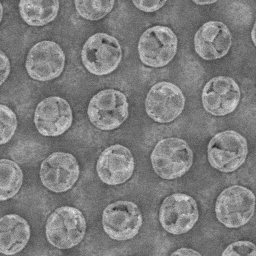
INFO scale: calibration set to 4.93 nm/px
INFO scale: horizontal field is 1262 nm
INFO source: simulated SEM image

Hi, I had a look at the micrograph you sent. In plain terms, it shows a regular array of raised bodies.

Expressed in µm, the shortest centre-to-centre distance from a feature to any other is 0.275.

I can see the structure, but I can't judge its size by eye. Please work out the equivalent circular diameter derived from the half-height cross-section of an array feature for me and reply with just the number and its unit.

189 nm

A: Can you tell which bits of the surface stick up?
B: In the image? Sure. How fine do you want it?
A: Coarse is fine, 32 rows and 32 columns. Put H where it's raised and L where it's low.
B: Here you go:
LLLHHHHLLLHHHHLLLHHHLLLLLLLLLLLL
LLLHHHHLLLHHHHLLLLLLLLLLLLLLLLLL
LLLHHHLLLLLLLLLLLLLLLLLLLLLLLLLL
LLLLLLLLLLLLLLLLLLLHHLLLLHHHLLLL
LLLLLLLLLLLLHLLLLLHHHHLLLHHHHLLL
LLLLLHHLLLLHHHHLLHHHHHLLHHHHHLLL
LLLLHHHHLLHHHHHLLLHHHHLLLHHHLLLL
HLLHHHHHLLHHHHHLLLHHHLLLLLLLLLLL
HLLHHHHHLLLHHHLLLLLLLLLLLLLLLLLL
HLLLHHHLLLLLLLLLLLLLLLLLLLLLLLLL
LLLLLLLLLLLLLLLLLLLLHLLLLLHHHLLL
LLLLLLLLLLLLLHHLLLLHHHLLLHHHHHLL
LLLLLLHHLLLHHHHHLLHHHHHLLHHHHHLL
HLLLLHHHHLLHHHHHLLHHHHHLLLHHHLLL
HHLLHHHHHLLHHHHHLLLHHHLLLLLLLLLL
HHLLHHHHHLLLHHHLLLLLLLLLLLLLLLLL
HHLLLHHHLLLLLLLLLLLLLLLLLLLLHLLL
HLLLLLLLLLLLLLLLLLLLHHHLLLLHHHLL
LLLLLLLLLLLLLLHHLLLHHHHHLLHHHHHL
LLLLLLHHHLLLLHHHLLLHHHHHLLHHHHHL
HHLLLHHHHHLLHHHHHLLHHHHHLLHHHHLL
HHHLLHHHHHLLHHHHLLLLHHHLLLLLLLLL
HHHLLHHHHLLLLHHHLLLLLLLLLLLLLLLL
HHLLLLHHHLLLLLLLLLLLLLLLLLLLLHLL
HLLLLLLLLLLLLLLLLLLLLHHLLLLLHHHH
LLLLLLLLLLLLLLHHHLLLHHHHLLLHHHHH
LLLLLLLHHHLLLHHHHLLLHHHHHLLHHHHH
HHHLLLHHHHHLLHHHHHLLHHHHHLLHHHHL
HHHHLLHHHHHLLHHHHLLLLHHHLLLLLLLL
HHHHLLHHHHLLLLHHHLLLLLLLLLLLLLLL
HHHLLLLHHHLLLLLLLLLLLLLLLLLLLLHL
HHLLLLLLLLLLLLLLLLLLLLHHHLLLHHHH